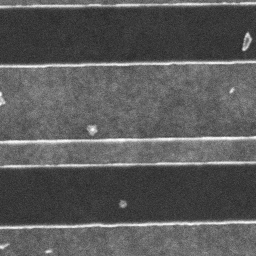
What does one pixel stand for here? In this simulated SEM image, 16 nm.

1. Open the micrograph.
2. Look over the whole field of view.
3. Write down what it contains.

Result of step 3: lines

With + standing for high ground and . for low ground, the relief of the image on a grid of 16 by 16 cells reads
++++++++++++++++
++++++++++++++++
++++++++++++++++
++++++++++++++++
................
................
................
................
................
++++++++++++++++
++++++++++++++++
++++++++++++++++
++++++++++++++++
++++++++++++++++
................
................